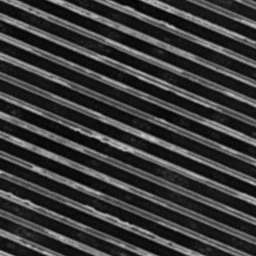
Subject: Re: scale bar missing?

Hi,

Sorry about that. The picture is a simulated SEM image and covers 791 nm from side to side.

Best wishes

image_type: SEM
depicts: parallel lines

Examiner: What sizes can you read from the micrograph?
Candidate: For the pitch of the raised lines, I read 55.9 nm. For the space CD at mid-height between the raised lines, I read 0.0381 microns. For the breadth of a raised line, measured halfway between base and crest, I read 17.4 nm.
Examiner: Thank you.